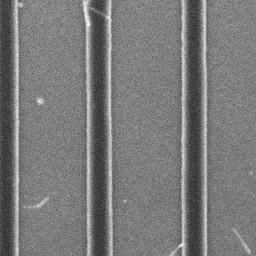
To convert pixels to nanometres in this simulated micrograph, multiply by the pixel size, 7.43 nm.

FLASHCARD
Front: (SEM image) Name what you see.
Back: lines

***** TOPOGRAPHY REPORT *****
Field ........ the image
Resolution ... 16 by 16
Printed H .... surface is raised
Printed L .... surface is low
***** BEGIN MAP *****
HLLLLHHLLLLHHLLL
HLLLLHHLLLLHHLLL
HLLLLHHLLLLHHLLL
HLLLLHHLLLLHHLLL
HLLLLHHLLLLHHLLL
HLLLLHHLLLLHHLLL
HLLLLHHLLLLHHLLL
HLLLLHHLLLLHHLLL
HLLLLHHLLLLHHLLL
HLLLLHHLLLLHHLLL
HLLLLHHLLLLHHLLL
HLLLLHHLLLLHHLLL
HLLLLHHLLLLHHLLL
HLLLLHHLLLLHHLLL
HLLLLHHLLLLHHLLL
HLLLLLHLLLLHHLLL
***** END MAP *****